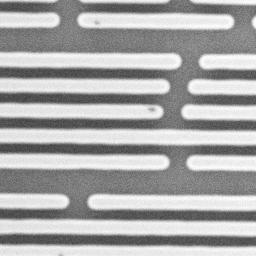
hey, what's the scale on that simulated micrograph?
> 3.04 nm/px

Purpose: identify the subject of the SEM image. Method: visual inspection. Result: groups of lines, slits or small figures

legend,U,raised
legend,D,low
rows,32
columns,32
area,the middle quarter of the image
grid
UUUUUUUUUUUUUUUUUUUUUUUUUUUUDDDD
DDDDDDDDDDDDDDDDDDDDDDDDDDDDDDDD
DDDDDDDDDDDDDDDDDDDDDDDDDDDDDDDD
DDDDDDDDDDDDDDDDDDDDDDDDDDDDDDDD
UUUUUUUUUUUUUUUUUUUUUUUUUUDDDDDD
UUUUUUUUUUUUUUUUUUUUUUUUUUDDDDDU
UUUUUUUUUUUUUUUUUUUUUUUUUUDDDDDD
DDDDDDDDDDDDDDDDDDDDDDDDDDDDDDDD
DDDDDDDDDDDDDDDDDDDDDDDDDDDDDDDD
DDDDDDDDDDDDDDDDDDDDDDDDDDDDDDDD
UUUUUUUUUUUUUUUUUUUUDDDDDDDDDDDD
UUUUUUUUUUUUUUUUUUUUUUUUDDDDDDUU
UUUUUUUUUUUUUUUUUUUUUUUUDDDDDDUU
DDDDDDDDDDDUUUUUUUUDDDDDDDDDDDDU
DDDDDDDDDDDDDDDDDDDDDDDDDDDDDDDD
DDDDDDDDDDDDDDDDDDDDDDDDDDDDDDDD
DDUUUUUUDDDUUUUUUDDDDDDDDDDDDDDD
UUUUUUUUUUUUUUUUUUUUUUUUUUUUUUUU
UUUUUUUUUUUUUUUUUUUUUUUUUUUUUUUU
UUUUUUUUUUUUUUUUUUUUUUUUUUUUUUUU
DDDDDDDDDDDDDDDDDDDDDDDDDDDDDDDD
DDDDDDDDDDDDDDDDDDDDDDDDDDDDDDDD
DDDDDDDDDDDDDDDDDDDDDDDDDDDDDDDD
UUUUUUUUUUUUUUUUUUUUUUUUUUDDDDDD
UUUUUUUUUUUUUUUUUUUUUUUUUUDDDDDU
UUUUUUUUUUUUUUUUUUUUUUUUUUDDDDDU
DDDDDDDDDDDDDDDDDDDDDDDDDDDDDDDD
DDDDDDDDDDDDDDDDDDDDDDDDDDDDDDDD
DDDDDDDDDDDDDDDDDDDDDDDDDDDDDDDD
DDDDDDDDDDDDDDDDDDDDDDDDDDDDDDDD
DDDDDDDDDDDDDDDDDDDDDDDDDDDDDDDD
DDDDDDDDDDDDDDDDDDDDDDDDDDDDDDDD